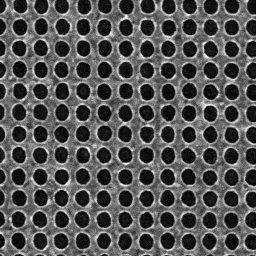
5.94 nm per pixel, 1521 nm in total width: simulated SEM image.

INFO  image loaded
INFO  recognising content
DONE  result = a regular array of holes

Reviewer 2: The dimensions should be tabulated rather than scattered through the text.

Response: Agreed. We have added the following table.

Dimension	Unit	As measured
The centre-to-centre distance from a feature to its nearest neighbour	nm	123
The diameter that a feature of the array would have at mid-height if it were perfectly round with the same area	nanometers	94.3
